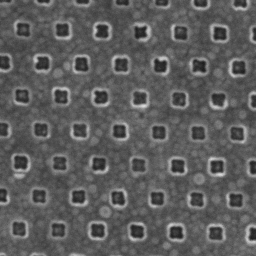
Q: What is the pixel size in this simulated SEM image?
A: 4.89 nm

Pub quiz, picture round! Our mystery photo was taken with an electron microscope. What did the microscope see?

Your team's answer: a regular array of holes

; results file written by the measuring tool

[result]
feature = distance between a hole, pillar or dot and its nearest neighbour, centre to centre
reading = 38.3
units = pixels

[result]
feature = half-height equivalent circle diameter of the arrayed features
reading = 71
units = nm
